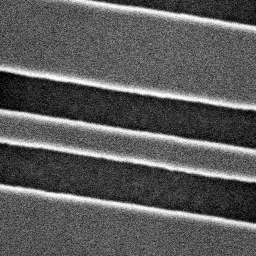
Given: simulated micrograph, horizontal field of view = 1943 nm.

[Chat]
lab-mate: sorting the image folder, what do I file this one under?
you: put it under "lines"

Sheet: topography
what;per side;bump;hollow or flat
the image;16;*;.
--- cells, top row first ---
*********.......
***************.
****************
****************
.***************
......**********
.............***
****............
***********.....
....************
..........******
................
******..........
*************...
****************
****************